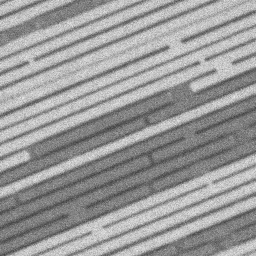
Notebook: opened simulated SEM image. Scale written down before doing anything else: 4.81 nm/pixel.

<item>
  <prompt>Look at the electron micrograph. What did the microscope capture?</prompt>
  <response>parallel lines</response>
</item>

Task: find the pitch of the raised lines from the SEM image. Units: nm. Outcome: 62.5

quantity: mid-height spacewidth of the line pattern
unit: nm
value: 17.3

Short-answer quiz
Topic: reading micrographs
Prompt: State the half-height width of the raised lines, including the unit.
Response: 9.83 px